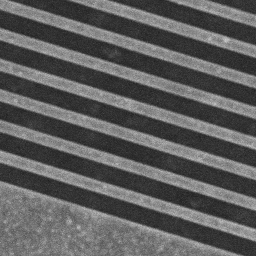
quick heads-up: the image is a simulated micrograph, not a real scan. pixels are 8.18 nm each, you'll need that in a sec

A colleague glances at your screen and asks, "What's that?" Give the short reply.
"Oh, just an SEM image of parallel lines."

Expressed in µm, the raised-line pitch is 0.239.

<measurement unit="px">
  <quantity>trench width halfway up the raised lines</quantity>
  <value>18.1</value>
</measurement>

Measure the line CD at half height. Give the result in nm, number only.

88.9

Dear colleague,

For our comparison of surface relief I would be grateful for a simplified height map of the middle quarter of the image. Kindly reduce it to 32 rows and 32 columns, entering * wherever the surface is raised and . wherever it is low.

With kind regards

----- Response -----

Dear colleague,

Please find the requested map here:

.....*********................**
........*********...............
............*********...........
...............*********........
***...............*********.....
******...............*********..
*********...............********
...*********................****
......**********...............*
..........*********.............
.............*********..........
*...............*********.......
****...............**********...
*******................*********
.*********................******
.....*********...............***
........*********...............
...........*********............
..............*********.........
*.................*********.....
*****................*********..
*********...............********
..**********...............*****
.....*********................**
........**********..............
............*********...........
...............*********........
***...............**********....
******...............**********.
*********................*******
...*********................****
.......*********...............*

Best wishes